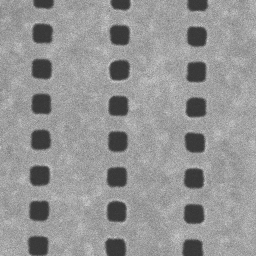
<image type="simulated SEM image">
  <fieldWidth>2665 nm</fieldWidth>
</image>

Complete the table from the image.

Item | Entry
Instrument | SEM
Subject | a regular array of holes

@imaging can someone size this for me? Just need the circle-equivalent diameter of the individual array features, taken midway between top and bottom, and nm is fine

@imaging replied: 220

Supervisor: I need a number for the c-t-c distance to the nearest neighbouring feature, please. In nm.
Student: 367